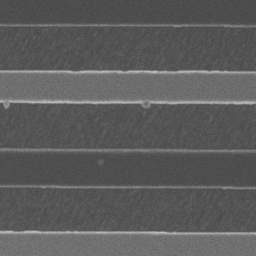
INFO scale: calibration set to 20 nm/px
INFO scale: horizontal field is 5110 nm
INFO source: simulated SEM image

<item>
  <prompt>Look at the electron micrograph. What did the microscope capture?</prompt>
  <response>lines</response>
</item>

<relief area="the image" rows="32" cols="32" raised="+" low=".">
++++++++++++++++++++++++++++++++
++++++++++++++++++++++++++++++++
++++++++++++++++++++++++++++++++
................................
................................
................................
................................
................................
................................
++++++++++++++++++++++++++++++++
++++++++++++++++++++++++++++++++
++++++++++++++++++++++++++++++++
++++++++++++++++++++++++++++++++
................................
................................
................................
................................
................................
................................
++++++++++++++++++++++++++++++++
++++++++++++++++++++++++++++++++
++++++++++++++++++++++++++++++++
++++++++++++++++++++++++++++++++
...........................+++++
................................
................................
................................
................................
................................
++++++++++++++++++++++++++++++++
++++++++++++++++++++++++++++++++
++++++++++++++++++++++++++++++++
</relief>